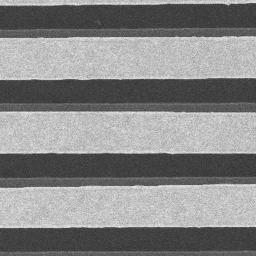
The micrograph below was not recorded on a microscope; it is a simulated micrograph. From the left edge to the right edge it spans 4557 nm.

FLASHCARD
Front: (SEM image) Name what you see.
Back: lines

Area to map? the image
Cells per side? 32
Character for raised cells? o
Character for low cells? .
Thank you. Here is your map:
ooooooooooooooooooooo.......o...
................................
................................
................................
oooooooooooooooooooooooooooooooo
oooooooooooooooooooooooooooooooo
oooooooooooooooooooooooooooooooo
oooooooooooooooooooooooooooooooo
oooooooooooooooooooooooooooooooo
oooooooooooooooooooooooooooooooo
................................
................................
................................
oooooooooooooooooooooooooooooooo
oooooooooooooooooooooooooooooooo
oooooooooooooooooooooooooooooooo
oooooooooooooooooooooooooooooooo
oooooooooooooooooooooooooooooooo
oooooooooooooooooooooooooooooooo
................................
................................
................................
oooooooooooooooooooooooooooooooo
oooooooooooooooooooooooooooooooo
oooooooooooooooooooooooooooooooo
oooooooooooooooooooooooooooooooo
oooooooooooooooooooooooooooooooo
oooooooooooooooooooooooooooooooo
................................
................................
................................
..............................o.